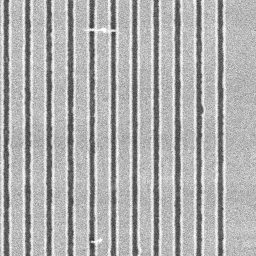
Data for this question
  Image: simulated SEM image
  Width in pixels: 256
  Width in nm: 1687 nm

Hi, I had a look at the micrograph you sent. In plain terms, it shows parallel lines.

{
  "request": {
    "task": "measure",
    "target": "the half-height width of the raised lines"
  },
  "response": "102 nm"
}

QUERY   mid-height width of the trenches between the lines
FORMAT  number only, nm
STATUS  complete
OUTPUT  38.7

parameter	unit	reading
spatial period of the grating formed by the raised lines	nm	141